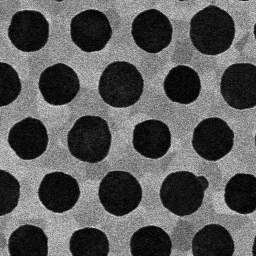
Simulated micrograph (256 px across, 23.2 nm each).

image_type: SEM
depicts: a regular array of holes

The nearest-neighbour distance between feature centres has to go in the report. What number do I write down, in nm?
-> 1420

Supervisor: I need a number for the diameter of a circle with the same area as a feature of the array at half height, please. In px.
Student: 42.4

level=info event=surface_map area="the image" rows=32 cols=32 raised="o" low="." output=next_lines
oooooooooooooooooooooooooooooooo
oo...ooooo...ooooo..ooooo...oooo
o.....ooo.....ooo....ooo.....ooo
o.....ooo.....oo.....ooo.....ooo
o.....ooo.....ooo....ooo.....ooo
oo....ooo....oooo....ooo.....ooo
ooo.ooooooo.oooooo..ooooo...oooo
oooooooooooooooooooooooooooooooo
..oooo...oooo....ooooo..oooo....
..ooo.....ooo.....ooo....ooo....
...oo.....oo......ooo....ooo....
...oo.....oo......ooo....ooo....
..oooo...oooo....oooo...oooo....
ooooooooooooooooooooooooooooo..o
ooooooooooo.oooooooooooooooooooo
oo...oooo....oooo....oooo...oooo
o.....ooo.....ooo....ooo.....ooo
o.....oo......ooo....ooo.....ooo
o.....ooo.....ooo....ooo.....ooo
oo...oooo....ooooo..ooooo...oooo
oooooooooooooooooooooooooooooooo
.oooooo.oooooo..oooooo..oooooooo
..ooo.....ooo....oooo.....ooo...
..ooo.....oo......oo......oo....
..ooo.....oo......oo.....ooo....
..ooo....oooo....ooo.....ooo....
.oooooo.ooooo...ooooo...oooooo.o
oooooooooooooooooooooooooooooooo
oo...ooooo..oooooo..ooooo...oooo
o.....ooo....ooo.....ooo.....ooo
o.....ooo.....oo.....ooo.....ooo
o.....ooo.....oo.....ooo.....oo.